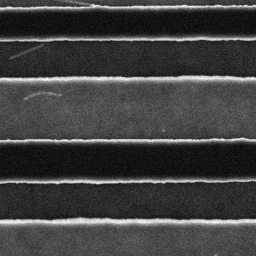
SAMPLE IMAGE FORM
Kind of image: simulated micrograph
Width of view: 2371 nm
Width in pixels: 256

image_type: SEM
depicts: lines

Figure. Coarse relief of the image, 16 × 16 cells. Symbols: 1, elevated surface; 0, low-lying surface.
1111111111111111
1111111111111111
1111111011010000
0000000000000000
0000000000000000
1111111111111111
1111111111111111
1111111111111111
1111111111111111
1111111111111111
1111111111111111
0000000000000000
0000000000000000
0000000000000000
1111111111111111
1111111111111111